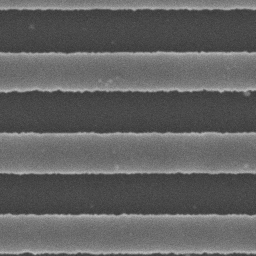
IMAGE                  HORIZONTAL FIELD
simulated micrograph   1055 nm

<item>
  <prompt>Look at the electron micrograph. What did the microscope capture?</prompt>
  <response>lines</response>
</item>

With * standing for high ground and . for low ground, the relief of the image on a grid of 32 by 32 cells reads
********************************
................................
................................
................................
................................
................................
...................**.........*.
********************************
********************************
********************************
********************************
*...............................
................................
................................
................................
................................
................................
********************************
********************************
********************************
********************************
********************************
................................
................................
................................
................................
................................
********************************
********************************
********************************
********************************
********************************